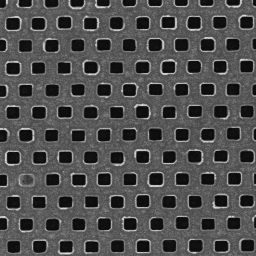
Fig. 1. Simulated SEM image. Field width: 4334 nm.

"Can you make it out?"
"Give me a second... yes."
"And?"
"a regular array of holes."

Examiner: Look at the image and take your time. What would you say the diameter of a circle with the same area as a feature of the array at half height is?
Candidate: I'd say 232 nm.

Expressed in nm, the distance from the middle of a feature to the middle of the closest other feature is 430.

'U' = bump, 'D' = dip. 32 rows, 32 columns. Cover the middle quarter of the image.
DDUUUDDDUUUDDDDUUUDDDUUUDDDDUUUD
DDUUUDDDUUUDDDDUUUDDDUUUDDDDUUUD
DUUUUUUUUUUUUUUUUUUUUUUUUUUUUUUU
UUUUUUUUUUUUUUUUUUUUUUUUUUUUUUUU
UUUUUUUUUUUUUUUUUUUUUUUUUUUUUUUU
UUDDDUUUDDDDUUUDDDUUUDDDDUUUDDDU
UUDDDUUUDDDDUUUDDDUUUDDDDUUUDDDU
UUDDDUUUDDDUUUUDDDUUUDDDUUUUDDDU
UUUUUUUUUUUUUUUUUUUUUUUUUUUUUUUU
UUUUUUUUUUUUUUUUUUUUUUUUUUUUUUUU
UUUUUUUUUUUUUUUUUUUDDUUUUUUUUUUU
DDUUUDDDUUUDDDDUUUDDDUUUUDDDUUUD
DDUUUDDDUUUDDDDUUUDDDUUUUDDDUUUD
DUUUUDDDUUUUDDUUUUUDDUUUUDDUUUUU
UUUUUUUUUUUUUUUUUUUUUUUUUUUUUUUU
UUUUUUUUUUUUUUUUUUUUUUUUUUUUUUUU
UUDDDUUUUDDUUUUDDDUUUDDDUUUUDDDU
UUDDDUUUDDDDUUDDDDUUUDDDDUUUDDDU
UUDDDUUUDDDDUUUDDDUUUDDDUUUUDDDU
UUUUUUUUUUUUUUUUUUUUUUUUUUUUUUUU
UUUUUUUUUUUUUUUUUUUUUUUUUUUUUUUU
UUUUUUUUUUUUUUUUUUUUUUUUUUUUUUUU
DDUUUDDDUUUUDDDUUUDDDUUUUDDDUUUD
DDUUUDDDDUUUDDDUUUDDDUUUUDDDUUUD
DDUUUDDDUUUUDDDUUUDDDUUUUDDDUUUU
UUUUUUUUUUUUUUUUUUUUUUUUUUUUUUUU
UUUUUUUUUUUUUUUUUUUUUUUUUUUUUUUU
UUUDDUUUUDDDUUUDDDUUUUDDUUUUUDDU
UUDDDUUUDDDDUUUDDDUUUDDDDUUUDDDU
UUDDDUUUDDDDUUUDDDUUUDDDDUUUDDDU
UUUUUUUUUUUUUUUUUUUUUUUUUUUUUUUU
UUUUUUUUUUUUUUUUUUUUUUUUUUUUUUUU